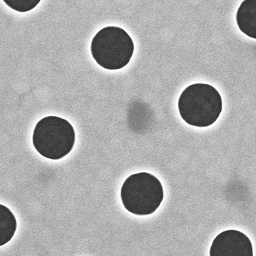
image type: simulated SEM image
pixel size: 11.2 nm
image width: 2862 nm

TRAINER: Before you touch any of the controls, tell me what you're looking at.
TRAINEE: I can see holes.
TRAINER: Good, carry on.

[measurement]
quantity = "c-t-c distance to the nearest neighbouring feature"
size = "1.17 micrometres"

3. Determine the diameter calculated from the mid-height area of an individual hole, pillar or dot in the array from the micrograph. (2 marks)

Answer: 484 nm